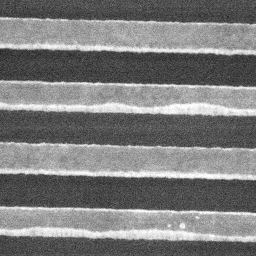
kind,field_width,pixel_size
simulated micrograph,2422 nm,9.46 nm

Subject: lines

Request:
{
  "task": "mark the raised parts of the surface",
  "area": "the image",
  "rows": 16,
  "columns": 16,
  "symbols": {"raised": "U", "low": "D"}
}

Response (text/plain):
DDDDDDDDDDDDDDDD
UUUUUUUUUUUUUUUD
UUUUUUUUUUUUUUUU
DDDDDDDDDDDDDDDD
DDDDDDDDDDDDDDDD
UUUUUUUUUUUUUUUU
UUUUUUUUUUUUUUUU
DDDDDDDDDDDDDDDD
DDDDDDDDDDDDDDDD
UUUUUUUUUUUUUUUU
UUUUUUUUUUUUUUUU
DDDDDDDDDDDDDDDD
DDDDDDDDDDDDDDDD
UUUUUUUUUUUUUUUU
UUUUUUUUUUUUUUUU
DDDDDDDDDDDDDDDD